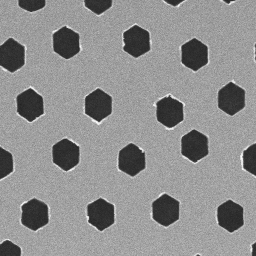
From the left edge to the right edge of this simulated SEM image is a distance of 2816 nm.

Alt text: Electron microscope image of a regular array of holes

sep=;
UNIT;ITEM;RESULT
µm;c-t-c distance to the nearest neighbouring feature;0.662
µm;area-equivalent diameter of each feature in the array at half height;0.317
